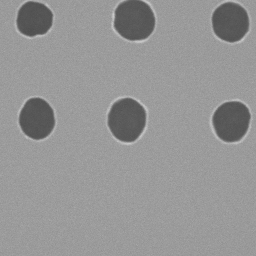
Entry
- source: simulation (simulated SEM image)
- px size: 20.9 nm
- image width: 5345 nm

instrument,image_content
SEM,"holes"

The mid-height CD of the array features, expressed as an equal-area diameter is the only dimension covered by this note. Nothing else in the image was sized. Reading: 0.823 microns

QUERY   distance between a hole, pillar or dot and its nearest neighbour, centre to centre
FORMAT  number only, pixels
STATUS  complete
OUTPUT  99.3